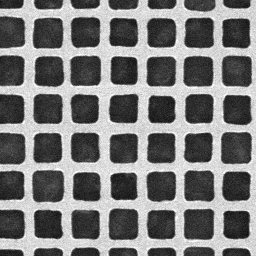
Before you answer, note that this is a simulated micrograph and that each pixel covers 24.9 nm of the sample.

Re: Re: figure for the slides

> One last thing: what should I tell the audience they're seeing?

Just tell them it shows a regular array of holes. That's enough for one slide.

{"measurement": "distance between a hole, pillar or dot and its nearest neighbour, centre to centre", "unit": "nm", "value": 928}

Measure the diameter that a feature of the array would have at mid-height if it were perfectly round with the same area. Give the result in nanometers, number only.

814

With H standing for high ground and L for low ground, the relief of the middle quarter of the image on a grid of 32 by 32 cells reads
HHLLLLLLLHHHLLLLLLHHLLLLLLLLHHLL
HHLLLLLLLHHLLLLLLLLHHLLLLLLLHHLL
HHLLLLLLLHHLLLLLLLLHHLLLLLLLHHLL
HHLLLLLLLHHLLLLLLLLHLLLLLLLLHHLL
HHLLLLLLLHHHLLLLLLHHHLLLLLLLHHLL
HHLLLLLLHHHHHHHHLHHHHLLLLLLHHHHL
HHHHHHHHHHHHHHHHHHHHHHHHHHHHHHHH
HHHLHHHHHHHHHHHHLLHHHHHHHHHHHHHH
HHLLLLLLLHHLLLLLLLLHHLLLLLLLHHLL
HLLLLLLLLHHLLLLLLLLHHLLLLLLLHHLL
HHLLLLLLLHHLLLLLLLLHHLLLLLLLHHLL
HHLLLLLLLHHLLLLLLLLHHLLLLLLLHHLL
HHLLLLLLLHHLLLLLLLLHHLLLLLLLHHLL
HHLLLLLLLHHLLLLLLLLHHLLLLLLLHHLL
HHLLLLLLHHHHLLLLLLHHHHLLLLLHHHHL
HHHHHHHHHHHHHHHHHHHHHHHHHHHHHHHH
HHHHHHHHHHHHHHHHHHHHHHHHHHHHHHHH
HHLLLLLLHHHHHLLLLLHHHLLLLLLLHHHL
HHLLLLLLLHHLLLLLLLLHHLLLLLLLHHLL
HHLLLLLLLHHLLLLLLLLHHLLLLLLLHHLL
HHLLLLLLLHHLLLLLLLLHHLLLLLLLHHLL
HHLLLLLLLHHLLLLLLLLHHLLLLLLLHHLL
HHLLLLLLLHHLLLLLLLLHHLLLLLLLHHLL
HHLLLLLLLHHLLLLLLLHHHLLLLLLLHHLL
HHHLLLLLHHHHLLLLLLHHHLLLLLLHHHHL
HHHHHHHHHHHHHHHHHHHHHHHHHHHHHHHH
HHHHHHHHHHHHHHHHHHHHHHHHHHHHHHHL
HHHLLLLLLHHHLLLLLLHHHLLLLLLLHHLL
HHLLLLLLLHHLLLLLLLHHHLLLLLLLHHLL
HHLLLLLLLHHHLLLLLLHHLLLLLLLLHHLL
HHLLLLLLLHHHLLLLLLHHHLLLLLLLHHLL
HHLLLLLLLHHLLLLLLLHHHLLLLLLLHHLL